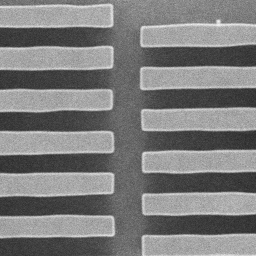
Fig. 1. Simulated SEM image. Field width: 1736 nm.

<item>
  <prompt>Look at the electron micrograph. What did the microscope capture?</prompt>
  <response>groups of lines, slits or small figures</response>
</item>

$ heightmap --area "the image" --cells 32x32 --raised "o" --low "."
................................
oooooooooooooo..................
oooooooooooooo..................
..................oooooooooooooo
..................oooooooooooooo
..................ooooooooooooo.
oooooooooooooo..................
oooooooooooooo..................
oooooooooooooo....oooooooooooooo
..................oooooooooooooo
..................oooooooooooooo
oooooooooooooo..................
oooooooooooooo..................
oooooooooooooo..............oooo
..................oooooooooooooo
..................oooooooooooooo
oo.ooo.....ooo..................
oooooooooooooo..................
oooooooooooooo..................
..................oooooooooooooo
..................oooooooooooooo
..................o.ooooo.......
oooooooooooooo..................
oooooooooooooo..................
oo.oooo...........oooooooooooooo
..................oooooooooooooo
..................oooooooooooooo
oooooooooooooo..................
oooooooooooooo..................
oooooooooooo......oooooooooooooo
..................oooooooooooooo
..................oooooooooooooo